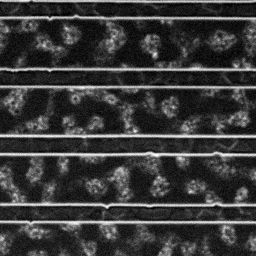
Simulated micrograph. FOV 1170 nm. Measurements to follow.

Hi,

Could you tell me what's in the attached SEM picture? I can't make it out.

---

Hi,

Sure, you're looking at one or a few lines or trenches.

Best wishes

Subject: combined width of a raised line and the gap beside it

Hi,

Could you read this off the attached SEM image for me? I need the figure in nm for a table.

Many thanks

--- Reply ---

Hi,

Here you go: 311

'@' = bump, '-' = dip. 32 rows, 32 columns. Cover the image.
--------------------------------
--------------------------------
@@@@@@@@@@@@@@@@@@@@@@@@@@@@@@@@
@@@@@@@@@@@@@@@@@@@@@@@@@@@@@@@@
@@@@@@@@@@@@@@@@@@@@@@@@@@@@@@@@
@@@@@@@@@@@@@@@@@@@@@@@@@@@@@@@@
@@@@@@@@@@@@@@@@@@@@@@@@@@@@@@@@
@@@@@@@@@@@@@@@@@@@@@@@@@@@@@@@@
@@@@@@@@@@@@@@@@@@@@@@@@@@@@@@@@
--------------------------------
--------------------------------
@@@@@@@@@@@@@@@@@@@@@@@@@@@@@@@@
@@@@@@@@@@@@@@@@@@@@@@@@@@@@@@@@
@@@@@@@@@@@@@@@@@@@@@@@@@@@@@@@@
@@@@@@@@@@@@@@@@@@@@@@@@@@@@@@@@
@@@@@@@@@@@@@@@@@@@@@@@@@@@@@@@@
@@@@@@@@@@@@@@@@@@@@@@@@@@@@@@@@
--------------------------------
--------------------------------
@@@@@@@@@@@@@@@@@@@@@@@@@@@@@@@@
@@@@@@@@@@@@@@@@@@@@@@@@@@@@@@@@
@@@@@@@@@@@@@@@@@@@@@@@@@@@@@@@@
@@@@@@@@@@@@@@@@@@@@@@@@@@@@@@@@
@@@@@@@@@@@@@@@@@@@@@@@@@@@@@@@@
@@@@@@@@@@@@@@@@@@@@@@@@@@@@@@@@
@@@@@@@@@@@@@@@@@@@@@@@@@@@@@@@@
--------------------------------
--------------------------------
@@@@@@@@@@@@@@@@@@@@@@@@@@@@@@@@
@@@@@@@@@@@@@@@@@@@@@@@@@@@@@@@@
@@@@@@@@@@@@@@@@@@@@@@@@@@@@@@@@
@@@@@@@@@@@@@@@@@@@@@@@@@@@@@@@@